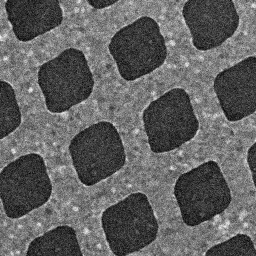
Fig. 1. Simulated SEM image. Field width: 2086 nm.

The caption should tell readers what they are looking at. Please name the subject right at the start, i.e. holes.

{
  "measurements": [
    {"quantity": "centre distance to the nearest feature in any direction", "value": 645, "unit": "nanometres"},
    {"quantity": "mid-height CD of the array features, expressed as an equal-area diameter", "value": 476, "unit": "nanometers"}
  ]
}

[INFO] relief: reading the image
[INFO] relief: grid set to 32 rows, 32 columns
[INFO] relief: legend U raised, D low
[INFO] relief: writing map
UDDDDDDDUUUDDDUUUUUUUUUDDDDDDUUU
UDDDDDDDUUUUUUUUUUUUUUUDDDDDDDUU
UDDDDDDDUUUUUUUUUDDUUUUDDDDDDDUU
UUDDDDDUUUUUUUUDDDDDUUUUDDDDDDUU
UUDDDUUUUUUUUUDDDDDDUUUUDDDDDUUU
UUUUUUUUUUUUUUDDDDDDDUUUDDDDUUUU
UUUUUUUUDDUUUUDDDDDDDUUUUUUUUUUU
UUUUUUDDDDDUUUDDDDDDDUUUUUUUUUDD
UUUUUDDDDDDUUUUDDDDDUUUUUUUUUDDD
UUUUUDDDDDDDUUUDDDUUUUUUUUUDDDDD
DUUUUDDDDDDDUUUUUUUUUUUUUUUDDDDD
DDUUUDDDDDDDUUUUUUUUUDDUUUUDDDDD
DDUUUUDDDDDUUUUUUUUDDDDDUUUDDDDD
DDUUUUDDDUUUUUUUUUDDDDDDUUUUDDDD
DDDUUUUUUUUUUUUUUUDDDDDDDUUUDDDU
DDDUUUUUUUUUDDUUUUDDDDDDDUUUUUUU
DDUUUUUUUUDDDDDUUUDDDDDDDUUUUUUU
UUUUUUUUUDDDDDDUUUDDDDDDUUUUUUUU
UUUUUUUUUDDDDDDDUUUDDDUUUUUUUUUD
UUUDDUUUUDDDDDDDUUUUUUUUUUUUUUUD
UDDDDDUUUDDDDDDDUUUUUUUUUDDUUUUD
DDDDDDUUUDDDDDDUUUUUUUUDDDDDUUUD
DDDDDDUUUUDDDUUUUUUUUUDDDDDDUUUU
DDDDDDDUUUUUUUUUUUUUUUDDDDDDDUUU
DDDDDDUUUUUUUUUUDDUUUUDDDDDDDUUU
DDDDDDUUUUUUUUDDDDDUUUDDDDDDDUUU
UDDDUUUUUUUUUDDDDDDUUUUDDDDDUUUU
UUUUUUUUUUUUUDDDDDDDUUUDDDUUUUUU
UUUUUUUDDUUUUDDDDDDDUUUUUUUUUUUU
UUUUUDDDDDUUUDDDDDDDUUUUUUUUUDDU
UUUUDDDDDDUUUDDDDDDUUUUUUUUDDDDD
UUUDDDDDDDUUUUDDDUUUUUUUUUDDDDDD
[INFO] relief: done